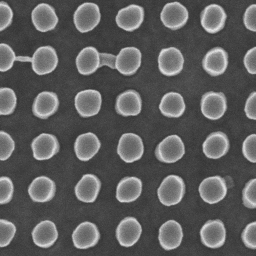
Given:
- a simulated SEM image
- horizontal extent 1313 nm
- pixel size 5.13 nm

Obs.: a regular array of raised bodies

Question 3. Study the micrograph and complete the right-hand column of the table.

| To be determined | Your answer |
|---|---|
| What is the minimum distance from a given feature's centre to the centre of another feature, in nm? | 213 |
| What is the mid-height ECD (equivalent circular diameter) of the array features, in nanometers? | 134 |